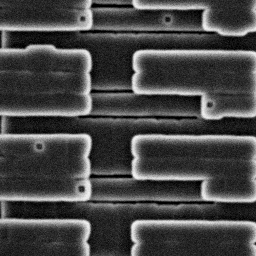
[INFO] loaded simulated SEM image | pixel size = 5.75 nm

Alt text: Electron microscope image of wiring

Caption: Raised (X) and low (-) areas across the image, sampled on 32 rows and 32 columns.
XXXXXXXXXXX------XXXXXXXXXXXXXXX
XXXXXXXXXXX--------------XXXXXXX
XXXXXXXXXXX--------------XXXXXXX
XXXXXXXXXXX---------------XXXXXX
--------------------------------
--------------------------------
XXXXXXXXXXX------XXXXXXXXXXXXXXX
XXXXXXXXXXX------XXXXXXXXXXXXXXX
XXXXXXXXXXX------XXXXXXXXXXXXXXX
XXXXXXXXXXX------XXXXXXXXXXXXXXX
XXXXXXXXXXX------XXXXXXXXXXXXXXX
XXXXXXXXXXX------XXXXXXXXXXXXXXX
XXXXXXXXXXX--------------XXXXXXX
XXXXXXXXXXX--------------XXXXXXX
-------------------------XXXXXXX
--------------------------------
--------------------------------
XXXXXXXXXXX------XXXXXXXXXXXXXXX
XXXXXXXXXXX------XXXXXXXXXXXXXXX
XXXXXXXXXXX------XXXXXXXXXXXXXXX
XXXXXXXXXXX------XXXXXXXXXXXXXXX
XXXXXXXXXXX------XXXXXXXXXXXXXXX
XXXXXXXXXXX--------------XXXXXXX
XXXXXXXXXXX--------------XXXXXXX
XXXXXXXXXXX--------------XXXXXXX
--------------------------------
--------------------------------
XXXX-XXXX-----------------------
XXXXXXXXXXX-----XXXXXXXXXXXXXXXX
XXXXXXXXXXX-----XXXXXXXXXXXXXXXX
XXXXXXXXXXX------XXXXXXXXXXXXXXX
XXXXXXXXXXX-----XXXXXXXXXXXXXXXX